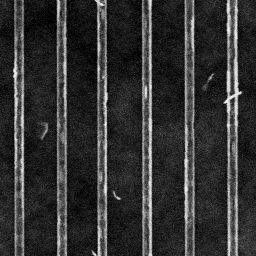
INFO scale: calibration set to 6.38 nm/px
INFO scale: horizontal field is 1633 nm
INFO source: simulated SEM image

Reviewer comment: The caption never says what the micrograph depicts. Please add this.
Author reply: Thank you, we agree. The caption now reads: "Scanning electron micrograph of parallel lines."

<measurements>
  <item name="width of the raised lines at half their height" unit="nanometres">57.4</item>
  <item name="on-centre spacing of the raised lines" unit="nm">273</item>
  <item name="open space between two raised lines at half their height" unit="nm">219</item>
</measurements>